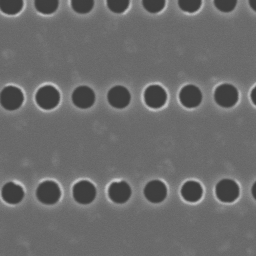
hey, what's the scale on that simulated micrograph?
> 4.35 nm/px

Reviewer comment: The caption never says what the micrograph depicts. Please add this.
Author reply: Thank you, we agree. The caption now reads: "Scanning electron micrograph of a regular array of holes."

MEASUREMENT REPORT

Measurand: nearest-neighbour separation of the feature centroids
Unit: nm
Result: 155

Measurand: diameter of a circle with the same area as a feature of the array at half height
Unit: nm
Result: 101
